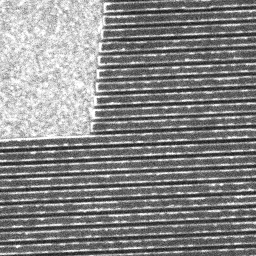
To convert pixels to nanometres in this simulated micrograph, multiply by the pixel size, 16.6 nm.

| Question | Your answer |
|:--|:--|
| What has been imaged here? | parallel lines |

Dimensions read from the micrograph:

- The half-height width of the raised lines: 8.62 px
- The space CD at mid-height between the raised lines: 64.3 nm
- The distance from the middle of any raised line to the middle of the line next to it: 220 nm